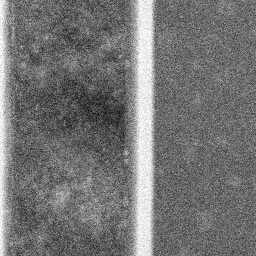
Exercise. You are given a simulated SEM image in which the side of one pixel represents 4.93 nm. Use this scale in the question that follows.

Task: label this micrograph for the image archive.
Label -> one or a few lines or trenches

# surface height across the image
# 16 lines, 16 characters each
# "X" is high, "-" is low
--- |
---------XXXXXXX
---------XXXXXXX
---------XXXXXXX
---------XXXXXXX
---------XXXXXXX
---------XXXXXXX
---------XXXXXXX
---------XXXXXXX
---------XXXXXXX
---------XXXXXXX
---------XXXXXXX
---------XXXXXXX
---------XXXXXXX
---------XXXXXXX
---------XXXXXXX
---------XXXXXXX